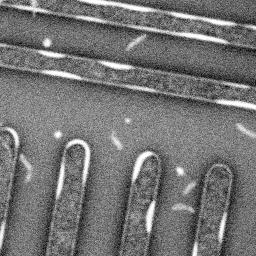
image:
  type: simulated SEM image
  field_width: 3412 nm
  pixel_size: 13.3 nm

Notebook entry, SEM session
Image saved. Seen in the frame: groups of lines, slits or small figures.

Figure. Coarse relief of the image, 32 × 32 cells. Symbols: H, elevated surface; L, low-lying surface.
HHHHHHHHHHHHHHLLLLLLLLLLLLLLLLLL
LLLLLLHHHHHHHHHHHHHHHLLLLLLLLLLL
LLLLLLLLLLLLHHHHHHHHHHHHHHLLLLLL
LLLLLLLLLLLLLLLLLLHHHHHHHHHHHHHH
LLLLLLLLLLLLLLLLLLLLLLLLHHHHHHHH
LLLLLLLLLLLLLLLLLLLLLLLLLLLLLHHH
HHHHHLLLLLLLLLLLLLLLLLLLLLLLLLLL
HHHHHHHHHHHLLLLLLLLLLLLLLLLLLLLL
LLHHHHHHHHHHHHHHHLLLLLLLLLLLLLLL
LLLLLLLLLHHHHHHHHHHHHHHLLLLLLLLL
LLLLLLLLLLLLLLHHHHHHHHHHHHHHHLLL
LLLLLLLLLLLLLLLLLLLLHHHHHHHHHHHH
LLLLLLLLLLLLLLLLLLLLLLLLLLHHHHHH
LLLLLLLLLLLLLLLLLLLLLLLLLLLLLLLL
LLLLLLLLLLLLLLLLLLLLLLLLLLLLLLLL
LLLLLLLLLLLLLLLLLLLLLLLLLLLLLLLL
HHLLLLLLLLLLLLLLLLLLLLLLLLLLLLLL
HHLLLLLLLLLLLLLLLLLLLLLLLLLLLLLL
HHLLLLLLHHHLLLLLLLLLLLLLLLLLLLLL
HHLLLLLLHHHLLLLLLLHLLLLLLLLLLLLL
HHLLLLLLHHHLLLLLLHHHLLLLLLLLLLLL
HHLLLLLLHHHLLLLLLHHHLLLLLLHHHLLL
HLLLLLLLHHHLLLLLLHHHLLLLLLHHHLLL
HLLLLLLHHHLLLLLLHHHHLLLLLLHHHLLL
HLLLLLLHHHLLLLLLHHHLLLLLLHHHHLLL
HLLLLLLHHHLLLLLLHHHLLLLLLHHHLLLL
HLLLLLLHHHLLLLLLHHHLLLLLLHHHLLLL
HLLLLLLHHHLLLLLLHHHLLLLLLHHHLLLL
LLLLLLHHHHLLLLLLHHLLLLLLLHHHLLLL
LLLLLLHHHLLLLLLHHHLLLLLLLHHHLLLL
LLLLLLHHHLLLLLLHHHLLLLLLLHHHLLLL
LLLLLLHHHLLLLLLHHHLLLLLLHHHLLLLL